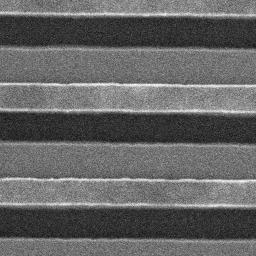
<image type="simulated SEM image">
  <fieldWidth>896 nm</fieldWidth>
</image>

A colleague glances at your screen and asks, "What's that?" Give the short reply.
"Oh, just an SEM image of lines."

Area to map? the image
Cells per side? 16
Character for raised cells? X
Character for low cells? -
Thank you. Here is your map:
XXXXXXXXXXXXXXXX
----------------
----------------
XXXXXXXXXXXXXXXX
XXXXXXXXXXXXXXXX
XXXXXXXXXXXXXXXX
XXXXXXXXXXXXXXXX
----------------
----------------
XXXXXXXXXXXXXXXX
XXXXXXXXXXXXXXXX
XXXXXXXXXXXXXXXX
XXXXXXXXXXXXXXXX
----------------
----------------
XXXXXXXXXXXXXXXX